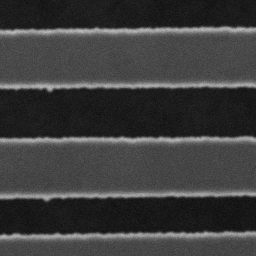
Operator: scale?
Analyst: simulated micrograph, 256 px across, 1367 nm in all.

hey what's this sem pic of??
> lines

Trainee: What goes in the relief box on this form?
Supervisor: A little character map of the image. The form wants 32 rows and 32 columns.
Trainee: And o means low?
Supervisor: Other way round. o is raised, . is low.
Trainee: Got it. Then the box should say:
................................
................................
................................
.........................oooo...
oooooooooooooooooooooooooooooooo
oooooooooooooooooooooooooooooooo
oooooooooooooooooooooooooooooooo
oooooooooooooooooooooooooooooooo
oooooooooooooooooooooooooooooooo
oooooooooooooooooooooooooooooooo
oooooooooooooooooooooooooooooooo
................................
................................
................................
................................
................................
................................
oooooooooooooooooooooooooooooooo
oooooooooooooooooooooooooooooooo
oooooooooooooooooooooooooooooooo
oooooooooooooooooooooooooooooooo
oooooooooooooooooooooooooooooooo
oooooooooooooooooooooooooooooooo
oooooooooooooooooooooooooooooooo
ooooooooooooooooooooo.oooo.o....
................................
................................
................................
................................
oooooooooooooooooooooooooooooooo
oooooooooooooooooooooooooooooooo
oooooooooooooooooooooooooooooooo